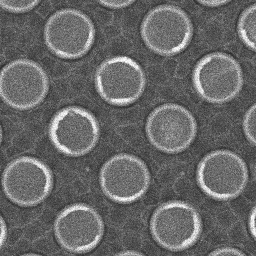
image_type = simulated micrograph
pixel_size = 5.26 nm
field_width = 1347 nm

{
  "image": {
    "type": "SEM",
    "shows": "a regular array of raised bodies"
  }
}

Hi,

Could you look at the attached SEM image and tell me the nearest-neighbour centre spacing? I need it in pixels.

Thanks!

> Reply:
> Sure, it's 68.4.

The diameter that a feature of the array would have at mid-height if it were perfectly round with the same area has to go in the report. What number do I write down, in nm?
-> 253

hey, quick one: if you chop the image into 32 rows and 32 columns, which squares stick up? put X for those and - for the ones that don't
XXXX---------XXX----------XX----
-------XXX---------XXXX--------X
------XXXXX-------XXXXXX------XX
------XXXXXX------XXXXXX------XX
------XXXXXX------XXXXXX------XX
------XXXXX-------XXXXX--------X
-------XXXX---------XX----------
--------------XX---------XXXX---
-XXXX-------XXXXXX------XXXXXX--
XXXXXX------XXXXXX------XXXXXX--
XXXXXX------XXXXXX------XXXXXX--
XXXXXX------XXXXXX-------XXXXX--
-XXXX--------XXXX---------XX----
--X------X----------XXX--------X
-------XXXXX-------XXXXX-------X
------XXXXXX------XXXXXX-------X
------XXXXXX------XXXXXX-------X
------XXXXXX-------XXXXX-------X
-------XXXX---------XXX---------
---------------X----------XXXX--
-XXXX--------XXXXX-------XXXXXX-
-XXXXX-------XXXXX-------XXXXXX-
XXXXXX-------XXXXXX------XXXXXX-
-XXXXX-------XXXXX-------XXXXX--
-XXXXX--------XXXX--------XXX---
--XX-----------------XX---------
--------XXXX-------XXXXXX-------
-------XXXXXX------XXXXXX------X
X------XXXXXX------XXXXXX------X
X------XXXXXX------XXXXXX-------
--------XXXX--------XXXX--------
----------------X----------XXX--